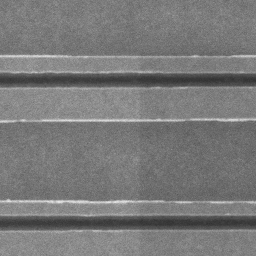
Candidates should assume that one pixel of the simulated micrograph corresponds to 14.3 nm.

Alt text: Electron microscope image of lines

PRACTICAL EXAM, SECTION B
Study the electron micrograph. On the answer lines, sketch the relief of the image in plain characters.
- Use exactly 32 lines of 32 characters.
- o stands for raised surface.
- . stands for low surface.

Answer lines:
................................
................................
................................
................................
................................
................................
................................
oooooooooooooooooooooooooooooooo
oooooooooooooooooooooooooooooooo
................................
................................
oooooooooooooooooooooooooooooooo
oooooooooooooooooooooooooooooooo
oooooooooooooooooooooooooooooooo
oooooooooooooooooooooooooooooooo
................................
................................
................................
................................
................................
................................
................................
................................
................................
................................
oooooooooooooooooooooooooooooooo
oooooooooooooooooooooooooooooooo
................................
................................
oooooooooooooooooooooooooooooooo
oooooooooooooooooooooooooooooooo
oooooooooooooooooooooooooooooooo